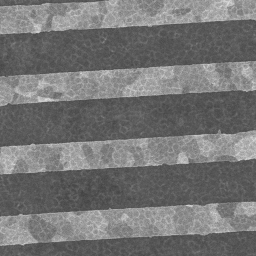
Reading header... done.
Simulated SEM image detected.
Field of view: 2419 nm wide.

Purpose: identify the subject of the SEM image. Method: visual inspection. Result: one or a few lines or trenches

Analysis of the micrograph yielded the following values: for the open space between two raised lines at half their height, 398 nanometers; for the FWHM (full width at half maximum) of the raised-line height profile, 27.6 pixels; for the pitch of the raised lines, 69.3 px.